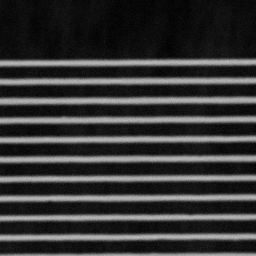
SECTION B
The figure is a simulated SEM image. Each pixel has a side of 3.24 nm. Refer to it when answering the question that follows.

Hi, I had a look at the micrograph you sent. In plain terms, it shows parallel lines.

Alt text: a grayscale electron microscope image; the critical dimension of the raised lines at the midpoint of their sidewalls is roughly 16.6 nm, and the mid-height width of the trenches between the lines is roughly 47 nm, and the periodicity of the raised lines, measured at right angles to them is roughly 0.0628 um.